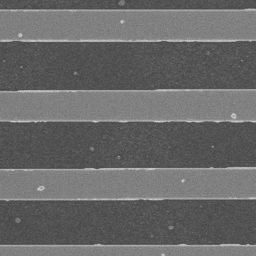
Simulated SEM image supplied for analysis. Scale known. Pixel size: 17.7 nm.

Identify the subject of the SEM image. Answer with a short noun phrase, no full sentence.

lines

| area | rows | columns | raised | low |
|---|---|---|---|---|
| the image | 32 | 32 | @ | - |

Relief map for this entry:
--------------------------------
@@@@@@@@@@@@@@@@@@@@@@@@@@@@@@@@
@@@@@@@@@@@@@@@@@@@@@@@@@@@@@@@@
@@@@@@@@@@@@@@@@@@@@@@@@@@@@@@@@
@@@@@@@@@@@@@@@@@@@@@@@@@@@@@@@@
--------------------------------
--------------------------------
--------------------------------
--------------------------------
--------------------------------
--------------------------------
@@@@@@@@@@@@@@@@@@@@@@@@@@@@@@@@
@@@@@@@@@@@@@@@@@@@@@@@@@@@@@@@@
@@@@@@@@@@@@@@@@@@@@@@@@@@@@@@@@
@@@@@@@@@@@@@@@@@@@@@@@@@@@@@@@@
--------------------------------
--------------------------------
--------------------------------
--------------------------------
--------------------------------
--------------------------------
@@@@@@@@@@@@@@@@@@@@@@@@@@@@@@@@
@@@@@@@@@@@@@@@@@@@@@@@@@@@@@@@@
@@@@@@@@@@@@@@@@@@@@@@@@@@@@@@@@
@@@@@@@@@@@@@@@@@@@@@@@@@@@@@@@@
--------------------------------
--------------------------------
--------------------------------
--------------------------------
--------------------------------
--------------------------------
@@@@@@@@@@@@@@@@@@@@@@@@@@@@@@@@